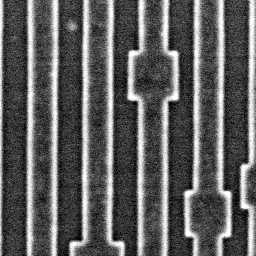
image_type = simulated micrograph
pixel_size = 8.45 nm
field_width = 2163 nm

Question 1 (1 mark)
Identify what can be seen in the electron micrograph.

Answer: wiring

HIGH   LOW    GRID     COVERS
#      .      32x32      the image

....###....###...####....###...#
....###....###...####...####...#
....###....###...####...####...#
....###....###...####...####...#
....###....###...####...####...#
....###....###...####...####...#
....###....###...#####..####...#
....###....###..######..####...#
....###....###..######..####...#
....###....###..######..####...#
....###....###..######..####...#
....###....###..######..####...#
....###....###...####...####...#
....###...####...####...####...#
....###...####...####...####...#
....###...####...####...####...#
....###...####...####...####...#
....###....###...####...####...#
....###....###...####...####...#
....###...####...####...####...#
....###...####...####...####...#
....###...####...####...####..##
....###...####...####...####..##
....###...####...####...####..##
....###...####...####..######.##
....###...####...####..######.##
....###...####...####..######..#
....###...####...####..######..#
....###...####...####..######..#
....###...####...####...####...#
....###..######..####...####...#
....###..######..####...####...#